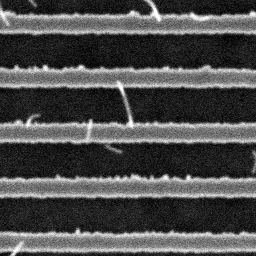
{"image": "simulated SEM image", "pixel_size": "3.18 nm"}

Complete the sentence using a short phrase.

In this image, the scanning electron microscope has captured lines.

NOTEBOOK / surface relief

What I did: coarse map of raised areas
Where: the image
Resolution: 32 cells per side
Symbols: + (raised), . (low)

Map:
................................
+..................+............
++++++++++++++++++++++++++++++++
++++++++++++++++++++++++++++++++
................................
................................
................................
................................
.....+..+++.........+....+......
++++++++++++++++++++++++++++++++
++++++++++++++++++++++++++++++++
................................
................................
................................
................................
.++++..+++.+.++.++++.++.....+.+.
++++++++++++++++++++++++++++++++
++++++++++++++++++++++++++++++++
................................
................................
................................
................................
++++++++++++++++++++++++++++++++
++++++++++++++++++++++++++++++++
++++++++++++++++++++++++++++++++
................................
................................
................................
................................
++++++++++++++++++++++++++++++++
++++++++++++++++++++++++++++++++
.+..............................